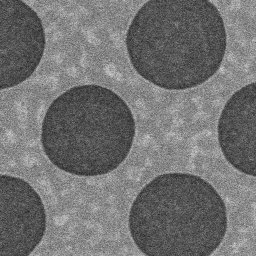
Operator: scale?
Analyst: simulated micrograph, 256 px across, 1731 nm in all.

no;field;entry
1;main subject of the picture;holes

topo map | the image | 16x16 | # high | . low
..#######.....##
...#####......##
...#####......##
...#####......##
..#######....###
#####..###..###.
###.....######..
###.....######..
###.....######..
###.....######..
####...########.
..#######....###
...#####......##
...#####......##
...#####......##
..#######.....##